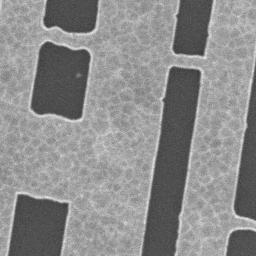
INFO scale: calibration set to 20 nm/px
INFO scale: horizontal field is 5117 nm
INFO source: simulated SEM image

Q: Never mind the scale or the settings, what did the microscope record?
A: one or a few lines or trenches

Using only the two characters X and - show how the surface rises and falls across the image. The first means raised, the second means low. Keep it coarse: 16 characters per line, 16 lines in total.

XXX---XXXXX--XXX
XXX---XXXXX--XXX
XXXXXXXXXXX--XXX
XX----XXXXXXXXXX
XX----XXXXX-XXXX
XX---XXXXX---XXX
XX---XXXXX--XXX-
XXXX-XXXXX--XXX-
XXXXXXXXXX--XXX-
XXXXXXXXXX--XXX-
XXXXXXXXXX--XXX-
XXXXXXXXX---XXX-
X---XXXXX--XXXX-
X---XXXXX--XXXX-
X---XXXXX--XXXX-
----XXXXX--XXX--